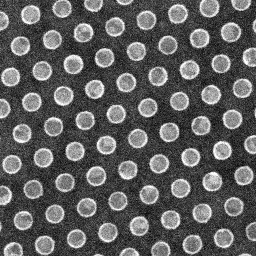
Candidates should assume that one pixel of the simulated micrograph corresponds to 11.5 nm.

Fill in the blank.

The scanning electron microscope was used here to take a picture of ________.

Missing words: a regular array of raised bodies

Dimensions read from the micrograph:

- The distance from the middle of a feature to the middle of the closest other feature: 0.368 um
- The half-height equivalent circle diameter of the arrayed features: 205 nanometers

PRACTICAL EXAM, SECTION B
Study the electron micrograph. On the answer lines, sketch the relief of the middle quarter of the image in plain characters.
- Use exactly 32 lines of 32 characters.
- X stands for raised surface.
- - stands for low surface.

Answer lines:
XXXXX----XX------------------XXX
-XXX------------------XXX----XXX
---------------X------XXXX---XXX
--------------XXX----XXXXX-----X
-------XX----XXXXX----XXX-------
------XXXX----XXXX--------------
XX----XXXX----XXX---------------
XX----XXXX------------------XX--
XX-------------------------XXXX-
X------------------XXXX----XXXX-
------------XX-----XXXX----XXXX-
-----------XXXX----XXXX---------
----XXX----XXXX----XXX----------
---XXXX----XXXX-----------------
---XXXX-----XX------------------
----XXX------------------XXX----
------------------------XXXX----
-----------------XXX----XXXX----
---------XXX----XXXXX----XXX----
---------XXXX---XXXXX-----------
-XXX----XXXXX----XXX------------
-XXXX----XXX-------------------X
-XXXX-------------------------XX
-XXX------------------XXX-----XX
---------------XX-----XXXX----XX
--------------XXXX----XXXX------
-------XXX----XXXX----XXX-------
X-----XXXX----XXXX--------------
XX----XXXX-----XX---------------
XX----XXXX------------------XXX-
XX-------------------------XXXX-
X------------------XXXX----XXXX-